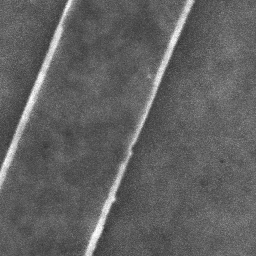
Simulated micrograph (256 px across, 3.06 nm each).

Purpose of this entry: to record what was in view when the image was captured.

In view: one or a few lines or trenches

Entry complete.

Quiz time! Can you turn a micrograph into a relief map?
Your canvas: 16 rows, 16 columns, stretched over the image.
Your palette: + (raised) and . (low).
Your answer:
....++++++++....
....+++++++.....
...++++++++.....
...++++++++.....
...+++++++......
..++++++++......
..+++++++.......
.++++++++.......
.++++++++.......
.+++++++........
++++++++........
+++++++.........
+++++++.........
+++++++.........
++++++..........
++++++..........